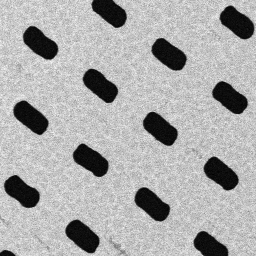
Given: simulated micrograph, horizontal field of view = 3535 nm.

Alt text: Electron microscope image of a regular array of holes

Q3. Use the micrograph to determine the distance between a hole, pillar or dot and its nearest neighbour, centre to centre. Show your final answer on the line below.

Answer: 1030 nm